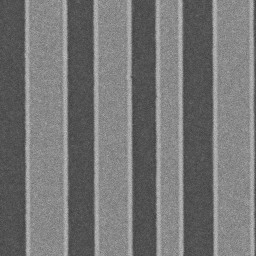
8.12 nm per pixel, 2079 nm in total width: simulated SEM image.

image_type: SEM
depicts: one or a few lines or trenches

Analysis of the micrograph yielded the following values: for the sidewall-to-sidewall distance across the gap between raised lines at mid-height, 242 nm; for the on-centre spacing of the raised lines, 506 nm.